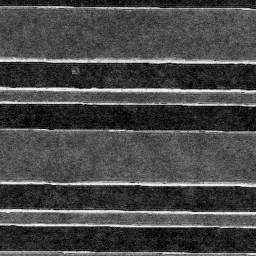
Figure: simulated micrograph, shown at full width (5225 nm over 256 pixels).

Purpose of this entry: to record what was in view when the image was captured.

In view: lines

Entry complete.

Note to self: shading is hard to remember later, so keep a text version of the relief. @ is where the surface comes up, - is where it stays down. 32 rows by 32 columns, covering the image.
--------------------------------
@@@@@@@@@@@@@@@@@@@@@@@@@@@@@@@@
@@@@@@@@@@@@@@@@@@@@@@@@@@@@@@@@
@@@@@@@@@@@@@@@@@@@@@@@@@@@@@@@@
@@@@@@@@@@@@@@@@@@@@@@@@@@@@@@@@
@@@@@@@@@@@@@@@@@@@@@@@@@@@@@@@@
@@@@@@@@@@@@@@@@@@@@@@@@@@@@@@@@
@@@@@@@@@@@@@@@@@@@@@@@@@@@@@@@@
--------------------------------
--------------------------------
--------------------------------
@@@@@@@@@@@@@@@@@@@@@@@@@@@@@@@@
@@@@@@@@@@@@@@@@@@@@@@@@@@@@@@@@
--------------------------------
--------------------------------
--------------------------------
@@@@@@@@@@@@@@@@@@@@@@@@@@@-----
@@@@@@@@@@@@@@@@@@@@@@@@@@@@@@@@
@@@@@@@@@@@@@@@@@@@@@@@@@@@@@@@@
@@@@@@@@@@@@@@@@@@@@@@@@@@@@@@@@
@@@@@@@@@@@@@@@@@@@@@@@@@@@@@@@@
@@@@@@@@@@@@@@@@@@@@@@@@@@@@@@@@
@@@@@@@@@@@@@@@@@@@@@@@@@@@@@@@@
--------------------------------
--------------------------------
--------------------------------
@@@@@@@@@@@@@@@@@@@@------------
@@@@@@@@@@@@@@@@@@@@@@@@@@@@@@@@
--------------------------------
--------------------------------
--------------------------------
--------------------------------